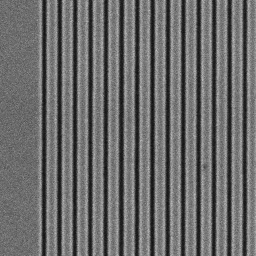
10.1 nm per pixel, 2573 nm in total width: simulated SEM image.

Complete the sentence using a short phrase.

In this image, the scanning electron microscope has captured parallel lines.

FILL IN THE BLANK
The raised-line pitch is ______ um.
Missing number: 0.155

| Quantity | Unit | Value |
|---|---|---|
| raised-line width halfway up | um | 0.107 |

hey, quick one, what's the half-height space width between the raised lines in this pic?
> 49 nanometers